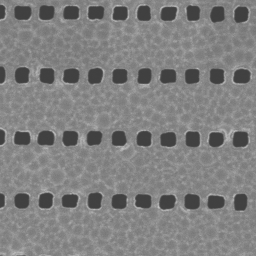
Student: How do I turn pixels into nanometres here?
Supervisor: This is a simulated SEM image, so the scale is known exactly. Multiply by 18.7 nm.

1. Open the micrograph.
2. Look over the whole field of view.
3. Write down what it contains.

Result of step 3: a regular array of holes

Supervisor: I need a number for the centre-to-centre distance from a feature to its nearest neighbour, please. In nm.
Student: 452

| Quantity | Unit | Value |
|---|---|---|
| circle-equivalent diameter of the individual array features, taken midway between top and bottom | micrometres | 0.305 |